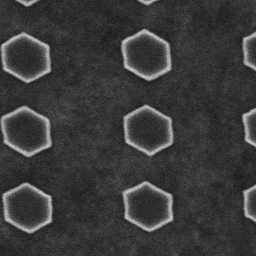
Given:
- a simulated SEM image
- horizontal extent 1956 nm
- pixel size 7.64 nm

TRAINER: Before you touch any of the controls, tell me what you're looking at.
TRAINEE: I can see raised bodies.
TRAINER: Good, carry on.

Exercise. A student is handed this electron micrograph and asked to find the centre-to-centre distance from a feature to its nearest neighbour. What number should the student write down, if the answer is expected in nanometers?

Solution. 573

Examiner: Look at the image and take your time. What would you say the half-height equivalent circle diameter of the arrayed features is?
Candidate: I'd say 351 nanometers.